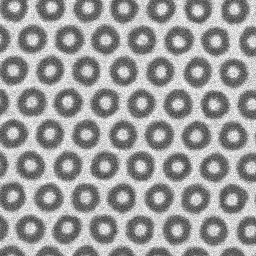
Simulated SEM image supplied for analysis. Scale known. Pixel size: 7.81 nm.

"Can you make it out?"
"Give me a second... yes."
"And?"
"a regular array of ring-shaped grooves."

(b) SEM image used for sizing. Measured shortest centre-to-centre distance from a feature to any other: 0.282 µm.